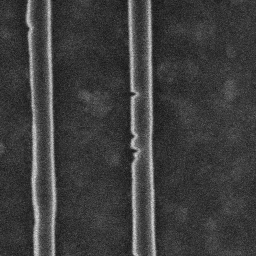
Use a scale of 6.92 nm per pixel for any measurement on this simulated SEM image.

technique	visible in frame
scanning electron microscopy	one or a few lines or trenches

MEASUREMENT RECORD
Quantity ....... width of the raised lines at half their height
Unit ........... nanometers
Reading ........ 130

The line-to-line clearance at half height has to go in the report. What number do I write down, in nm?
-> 558